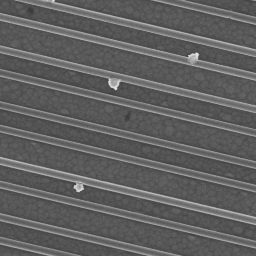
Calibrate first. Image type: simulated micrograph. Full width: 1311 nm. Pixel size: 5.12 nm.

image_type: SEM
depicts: parallel lines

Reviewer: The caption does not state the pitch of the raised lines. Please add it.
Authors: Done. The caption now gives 0.139 µm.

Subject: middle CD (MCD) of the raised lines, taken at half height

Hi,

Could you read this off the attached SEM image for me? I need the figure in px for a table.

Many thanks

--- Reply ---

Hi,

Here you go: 6.82